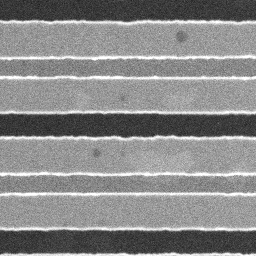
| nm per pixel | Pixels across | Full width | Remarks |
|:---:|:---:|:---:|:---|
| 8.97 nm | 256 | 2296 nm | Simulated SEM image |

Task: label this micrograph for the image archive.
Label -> lines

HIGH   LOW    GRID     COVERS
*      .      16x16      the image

................
****************
****************
****************
****************
****************
****************
................
................
****************
****************
****************
****************
****************
................
................